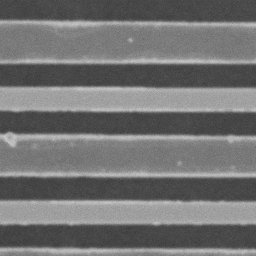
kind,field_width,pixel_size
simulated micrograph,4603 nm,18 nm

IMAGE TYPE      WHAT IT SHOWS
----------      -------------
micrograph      lines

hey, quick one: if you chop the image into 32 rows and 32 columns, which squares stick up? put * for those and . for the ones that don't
................................
................................
................................
********************************
********************************
********************************
********************************
********************************
................................
................................
................................
********************************
********************************
********************************
................................
................................
................................
********************************
********************************
********************************
********************************
********************************
................................
................................
................................
********************************
********************************
********************************
................................
................................
................................
********************************